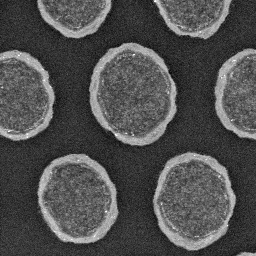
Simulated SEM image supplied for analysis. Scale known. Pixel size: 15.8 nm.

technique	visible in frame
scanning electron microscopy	raised bodies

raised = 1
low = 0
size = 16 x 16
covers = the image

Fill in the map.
0001111000111100
0001110000011100
0000000000000000
1000000111000001
1110001111000011
1110001111100011
1110001111100011
1110001111100011
0000000111000000
0000000000000000
0001110000011100
0001111000111100
0001111000111110
0001111000111100
0000110000111100
0000000000000000